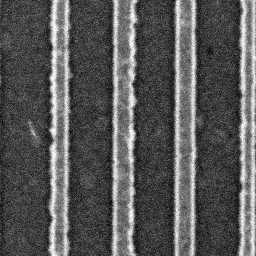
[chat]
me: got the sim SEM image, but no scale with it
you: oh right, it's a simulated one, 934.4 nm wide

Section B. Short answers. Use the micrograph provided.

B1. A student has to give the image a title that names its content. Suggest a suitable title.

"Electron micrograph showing one or a few lines or trenches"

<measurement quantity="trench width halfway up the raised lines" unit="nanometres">178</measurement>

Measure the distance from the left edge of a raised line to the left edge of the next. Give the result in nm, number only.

229